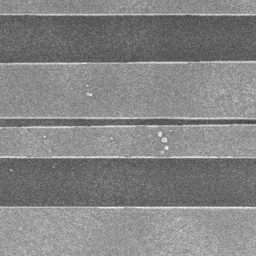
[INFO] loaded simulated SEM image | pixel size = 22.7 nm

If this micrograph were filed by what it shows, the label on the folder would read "lines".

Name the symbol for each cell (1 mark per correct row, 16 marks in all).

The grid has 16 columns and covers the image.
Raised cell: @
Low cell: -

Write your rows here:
@@@@@@@@@@@@@@@@
----------------
----------------
----------------
@@@@@@@@@@@@@@@@
@@@@@@@@@@@@@@@@
@@@@@@@@@@@@@@@@
@@@@@@@@@@@@@@@@
@@@@@@@@@@@@@@@@
@@@@@@@@@@@@@@@@
----------------
----------------
----------------
@@@@@@@@@@@@@@@@
@@@@@@@@@@@@@@@@
@@@@@@@@@@@@@@@@